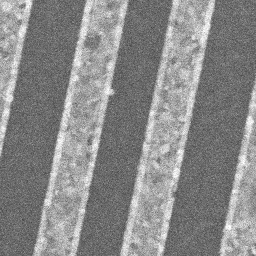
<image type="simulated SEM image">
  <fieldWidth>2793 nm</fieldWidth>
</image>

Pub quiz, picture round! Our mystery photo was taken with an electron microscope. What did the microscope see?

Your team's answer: one or a few lines or trenches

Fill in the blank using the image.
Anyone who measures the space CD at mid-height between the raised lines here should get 641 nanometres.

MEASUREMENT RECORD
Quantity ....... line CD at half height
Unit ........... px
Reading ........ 34.3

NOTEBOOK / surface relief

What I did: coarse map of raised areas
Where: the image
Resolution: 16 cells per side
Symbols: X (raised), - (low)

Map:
XX----XX---XX---
XX---XXX---XX---
X----XX----XX---
X----XX---XXX---
X----XX---XX----
X---XXX---XX----
----XX----XX----
----XX----XX----
----XX---XX----X
----XX---XX----X
---XXX---XX----X
---XX----XX----X
---XX---XXX----X
---XX---XX----XX
---XX---XX----XX
--XXX---XX----XX